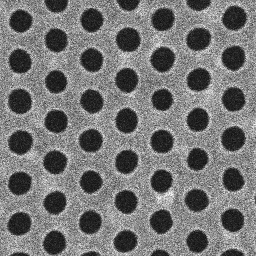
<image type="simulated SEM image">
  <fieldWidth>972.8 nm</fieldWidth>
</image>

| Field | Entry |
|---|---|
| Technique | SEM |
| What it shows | a regular array of holes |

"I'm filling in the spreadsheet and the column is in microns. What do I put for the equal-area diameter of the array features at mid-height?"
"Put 0.0906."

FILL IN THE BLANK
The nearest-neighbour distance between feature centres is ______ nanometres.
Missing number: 152